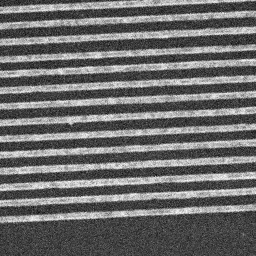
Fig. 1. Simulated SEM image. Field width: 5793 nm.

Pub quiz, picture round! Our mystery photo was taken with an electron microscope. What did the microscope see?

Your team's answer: parallel lines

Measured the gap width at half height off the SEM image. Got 246 nm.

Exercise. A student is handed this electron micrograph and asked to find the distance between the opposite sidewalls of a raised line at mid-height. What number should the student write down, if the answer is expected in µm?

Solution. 0.104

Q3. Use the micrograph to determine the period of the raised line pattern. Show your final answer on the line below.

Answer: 364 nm